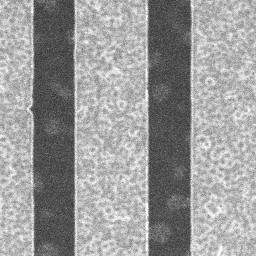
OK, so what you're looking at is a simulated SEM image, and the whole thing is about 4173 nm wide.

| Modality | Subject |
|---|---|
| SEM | one or a few lines or trenches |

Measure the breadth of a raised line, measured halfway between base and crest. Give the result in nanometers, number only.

723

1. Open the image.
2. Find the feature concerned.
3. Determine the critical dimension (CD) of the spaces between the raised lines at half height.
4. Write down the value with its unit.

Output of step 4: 1160 nanometers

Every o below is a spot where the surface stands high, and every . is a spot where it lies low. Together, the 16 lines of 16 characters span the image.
..ooo....ooo....
..ooo....ooo....
..ooo....ooo....
..ooo....ooo....
..ooo....ooo....
..ooo....ooo....
..ooo....ooo....
..ooo....ooo....
..ooo....ooo....
..ooo....ooo....
..ooo....ooo....
..ooo....ooo....
..ooo....ooo....
..ooo....ooo....
..ooo....ooo....
..ooo....ooo....